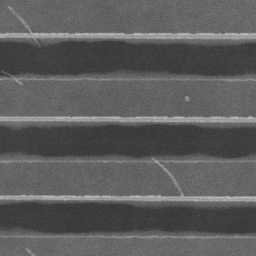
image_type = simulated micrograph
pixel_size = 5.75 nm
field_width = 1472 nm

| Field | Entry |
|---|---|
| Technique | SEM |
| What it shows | lines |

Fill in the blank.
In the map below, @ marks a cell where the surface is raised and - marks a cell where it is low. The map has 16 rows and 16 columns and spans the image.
@@@@@@@@@@@@@@@@
@@@@@@@@@@@@@@@@
----------------
----------------
----------------
@@@@@@@@@@@@@@@@
@@@@@@@@@@@@@@@@
@@@@@@@@@@@@@@@@
----------------
----------------
@@@@@@@@@@@@@@@@
@@@@@@@@@@@@@@@@
------@@@@@@@@@@
----------------
----------------
@@@@@@@@@@@@@@@@